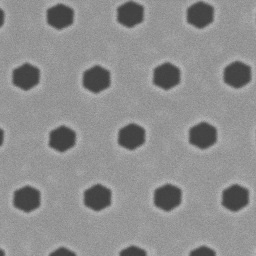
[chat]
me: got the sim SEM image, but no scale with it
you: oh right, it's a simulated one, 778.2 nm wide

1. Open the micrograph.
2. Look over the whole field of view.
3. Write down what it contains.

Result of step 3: a regular array of holes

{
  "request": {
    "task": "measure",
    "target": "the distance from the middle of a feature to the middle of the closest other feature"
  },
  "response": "211 nanometers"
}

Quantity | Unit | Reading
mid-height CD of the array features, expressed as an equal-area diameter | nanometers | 81.8